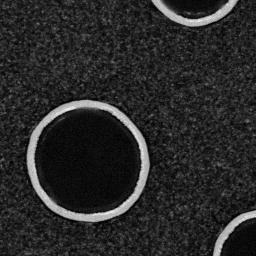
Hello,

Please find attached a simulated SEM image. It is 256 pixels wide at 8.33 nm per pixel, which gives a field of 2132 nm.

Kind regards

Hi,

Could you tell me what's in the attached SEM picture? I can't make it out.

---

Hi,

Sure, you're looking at raised bodies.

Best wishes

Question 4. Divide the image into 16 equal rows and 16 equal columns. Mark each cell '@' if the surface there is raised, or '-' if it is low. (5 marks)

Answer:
----------@@@@--
----------------
----------------
----------------
----------------
----------------
----------------
---@@@@@--------
--@@@@@@@-------
--@@@@@@@-------
--@@@@@@@-------
--@@@@@@@-------
---@@@@@--------
----@@@--------@
--------------@@
--------------@@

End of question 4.